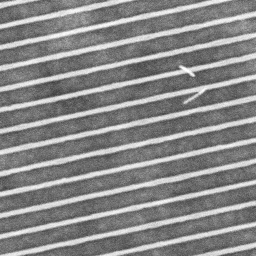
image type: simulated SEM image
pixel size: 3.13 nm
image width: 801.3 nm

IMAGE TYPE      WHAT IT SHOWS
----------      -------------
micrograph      parallel lines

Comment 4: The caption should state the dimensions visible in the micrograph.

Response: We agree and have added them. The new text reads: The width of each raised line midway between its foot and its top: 12.6 nm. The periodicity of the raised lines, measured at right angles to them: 0.0643 micrometres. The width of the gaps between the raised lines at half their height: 17 px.